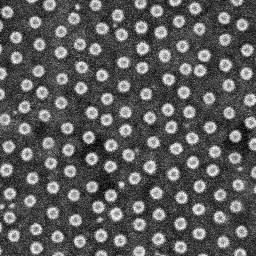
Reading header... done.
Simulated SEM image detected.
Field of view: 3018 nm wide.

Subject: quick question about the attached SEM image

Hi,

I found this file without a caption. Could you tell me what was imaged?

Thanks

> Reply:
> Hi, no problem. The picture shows a regular array of raised bodies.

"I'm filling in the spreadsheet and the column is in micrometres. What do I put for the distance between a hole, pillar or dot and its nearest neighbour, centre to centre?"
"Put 0.236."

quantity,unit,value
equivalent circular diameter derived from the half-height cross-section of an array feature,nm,123